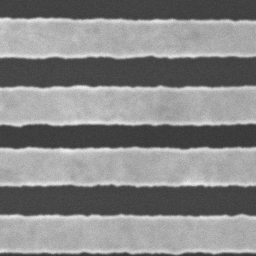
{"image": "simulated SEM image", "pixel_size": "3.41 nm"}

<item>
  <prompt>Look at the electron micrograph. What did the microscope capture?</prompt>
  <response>lines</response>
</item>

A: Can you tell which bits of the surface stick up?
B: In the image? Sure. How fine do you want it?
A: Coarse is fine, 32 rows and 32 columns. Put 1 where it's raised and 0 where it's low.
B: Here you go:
00000000000000000000000000000000
00000000000000000000000000000000
11111111111111110101110110111000
11111111111111111111111111111111
11111111111111111111111111111111
11111111111111111111111111111111
11111111111111111111111111111111
00000000000000000000000000000000
00000000000000000000000000000000
00000000000000000000000000000000
00000000000000000000000000000000
11111111111111111111111111111111
11111111111111111111111111111111
11111111111111111111111111111111
11111111111111111111111111111111
11110011110001111111111111111100
00000000000000000000000000000000
00000000000000000000000000000000
00011000000000001100000001000101
11111111111111111111111111111111
11111111111111111111111111111111
11111111111111111111111111111111
11111111111111111111111111111111
00000000000000000000000000000000
00000000000000000000000000000000
00000000000000000000000000000000
00000000000000000000000000000000
11111111111111111111111111111111
11111111111111111111111111111111
11111111111111111111111111111111
11111111111111111111111111111111
11111111111111111111111111111111